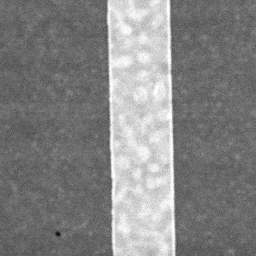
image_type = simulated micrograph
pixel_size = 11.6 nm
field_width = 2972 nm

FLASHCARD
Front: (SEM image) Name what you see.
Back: one or a few lines or trenches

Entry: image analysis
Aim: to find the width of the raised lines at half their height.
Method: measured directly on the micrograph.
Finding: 59.7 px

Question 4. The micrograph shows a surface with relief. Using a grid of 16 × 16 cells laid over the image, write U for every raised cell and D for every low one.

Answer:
DDDDDDDUUUUDDDDD
DDDDDDDUUUUDDDDD
DDDDDDDUUUUDDDDD
DDDDDDDUUUUDDDDD
DDDDDDDUUUUDDDDD
DDDDDDDUUUDDDDDD
DDDDDDDUUUUDDDDD
DDDDDDDUUUUDDDDD
DDDDDDDUUUUDDDDD
DDDDDDDUUUUDDDDD
DDDDDDDUUUUDDDDD
DDDDDDDUUUUDDDDD
DDDDDDDUUUUDDDDD
DDDDDDDUUUUDDDDD
DDDDDDDUUUUDDDDD
DDDDDDDUUUUDDDDD